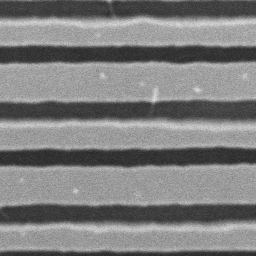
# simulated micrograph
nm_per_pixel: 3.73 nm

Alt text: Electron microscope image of lines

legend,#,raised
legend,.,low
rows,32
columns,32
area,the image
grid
................................
................................
################################
################################
################################
################################
................................
................................
################################
################################
################################
################################
########################..#####.
................................
................................
################################
################################
################################
#####################.#.........
................................
................................
################################
################################
################################
################################
#####..#################........
................................
................................
################################
################################
################################
................................